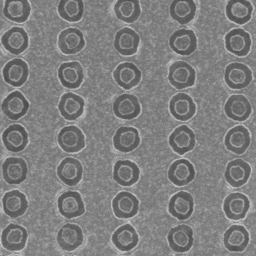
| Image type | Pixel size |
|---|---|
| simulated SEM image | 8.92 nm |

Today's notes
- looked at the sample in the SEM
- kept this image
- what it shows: a regular array of ring-shaped grooves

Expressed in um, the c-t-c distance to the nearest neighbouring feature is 0.288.